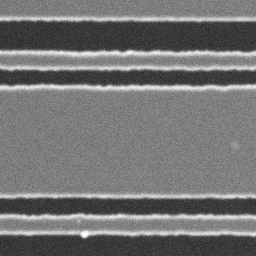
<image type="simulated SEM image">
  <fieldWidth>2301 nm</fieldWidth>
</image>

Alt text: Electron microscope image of lines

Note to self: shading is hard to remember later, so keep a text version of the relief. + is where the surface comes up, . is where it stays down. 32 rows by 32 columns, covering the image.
++++++++++++++++++++++++++++++++
++++++++++++++++++++++++++++++++
+++.++++++.+++++++++++++++++++++
................................
................................
................................
+++++++.....+.+.+..+....++......
++++++++++++++++++++++++++++++++
++++++++++++++++++++++++++++++++
................................
................................
++++++++++++++++++++++++++++++++
++++++++++++++++++++++++++++++++
++++++++++++++++++++++++++++++++
++++++++++++++++++++++++++++++++
++++++++++++++++++++++++++++++++
++++++++++++++++++++++++++++++++
++++++++++++++++++++++++++++++++
++++++++++++++++++++++++++++++++
++++++++++++++++++++++++++++++++
++++++++++++++++++++++++++++++++
++++++++++++++++++++++++++++++++
++++++++++++++++++++++++++++++++
++++++++++++++++++++++++++++++++
++++++++++++++++++++++++++++++++
................................
................................
++++++++++++++++++++++++++++++++
++++++++++++++++++++++++++++++++
..........+.....................
................................
................................